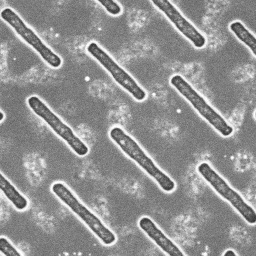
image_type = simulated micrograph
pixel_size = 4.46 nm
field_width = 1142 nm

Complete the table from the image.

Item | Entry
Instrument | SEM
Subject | holes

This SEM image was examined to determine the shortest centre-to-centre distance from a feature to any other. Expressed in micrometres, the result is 0.357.